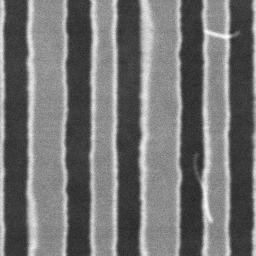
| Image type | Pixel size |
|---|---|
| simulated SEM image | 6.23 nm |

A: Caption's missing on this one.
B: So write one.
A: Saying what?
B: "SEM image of lines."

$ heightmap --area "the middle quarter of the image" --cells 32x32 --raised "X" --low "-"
-------XXXXXX-------XXXXXXXXX---
-------XXXXXX-------XXXXXXXXX---
-------XXXXXX------XXXXXXXXXX---
-------XXXXXX------XXXXXXXXXX---
-------XXXXXX------XXXXXXXXXX---
X------XXXXXX------XXXXXXXXXX---
X------XXXXXX------XXXXXXXXXX---
X------XXXXXX------XXXXXXXXXX---
X------XXXXXX------XXXXXXXXXX---
X------XXXXXX------XXXXXXXXXX---
X------XXXXXX------XXXXXXXXXX---
X------XXXXXX------XXXXXXXXXX---
X------XXXXXX------XXXXXXXXXX---
X------XXXXXX------XXXXXXXXXX---
-------XXXXXX------XXXXXXXXXX---
-------XXXXXX------XXXXXXXXXX---
-------XXXXXX------XXXXXXXXXX---
-------XXXXXX-------XXXXXXXXX---
-------XXXXXX------XXXXXXXXXX---
-------XXXXXX------XXXXXXXXXX---
-------XXXXXX------XXXXXXXXXX---
-------XXXXXX------XXXXXXXXXX---
------XXXXXXX------XXXXXXXXXX---
------XXXXXXX------XXXXXXXXXX---
-------XXXXXX------XXXXXXXXXX---
-------XXXXXX------XXXXXXXXXX---
X------XXXXXX------XXXXXXXXXX---
X------XXXXXX------XXXXXXXXXX---
X------XXXXXX------XXXXXXXXXX---
X------XXXXXX------XXXXXXXXXX---
-------XXXXXX------XXXXXXXXXX---
-------XXXXXX------XXXXXXXXXX---